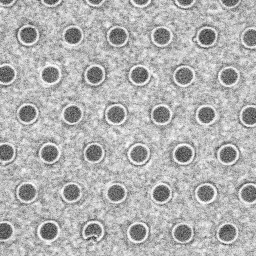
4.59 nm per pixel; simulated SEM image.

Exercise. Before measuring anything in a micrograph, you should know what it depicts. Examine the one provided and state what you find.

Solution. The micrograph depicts a regular array of raised bodies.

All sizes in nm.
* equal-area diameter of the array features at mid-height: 91.1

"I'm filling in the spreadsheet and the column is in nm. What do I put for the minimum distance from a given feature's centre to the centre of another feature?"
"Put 203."